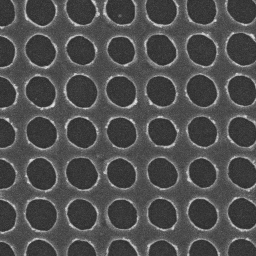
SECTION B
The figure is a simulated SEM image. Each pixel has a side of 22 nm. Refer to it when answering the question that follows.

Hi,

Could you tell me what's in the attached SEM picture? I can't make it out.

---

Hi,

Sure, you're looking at a regular array of holes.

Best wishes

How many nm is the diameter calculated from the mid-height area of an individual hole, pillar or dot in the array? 675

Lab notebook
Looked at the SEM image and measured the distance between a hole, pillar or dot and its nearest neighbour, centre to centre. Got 0.886 µm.